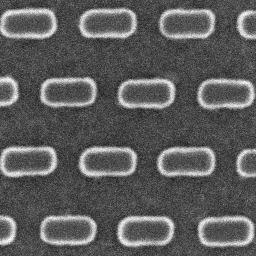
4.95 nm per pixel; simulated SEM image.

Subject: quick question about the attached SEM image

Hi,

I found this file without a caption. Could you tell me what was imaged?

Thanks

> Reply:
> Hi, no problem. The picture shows a regular array of raised bodies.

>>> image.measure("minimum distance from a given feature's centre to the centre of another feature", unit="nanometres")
386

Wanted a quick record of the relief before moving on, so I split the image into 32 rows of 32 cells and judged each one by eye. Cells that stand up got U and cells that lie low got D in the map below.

DDDDDDDDDDDDDDDDDDDDDDDDDDDDDDDD
DUUUUUDDDDDUUUUUDDDDDDUUUUDDDDDD
UUUUUUUDDDUUUUUUUDDDUUUUUUUDDDUU
UUUUUUUDDDUUUUUUUDDDUUUUUUUDDDUU
DUUUUDDDDDDUUUUDDDDDDUUUUUDDDDDU
DDDDDDDDDDDDDDDDDDDDDDDDDDDDDDDD
DDDDDDDDDDDDDDDDDDDDDDDDDDDDDDDD
DDDDDDDDDDDDDDDDDDDDDDDDDDDDDDDD
DDDDDDDDDDDDDDDDDDDDDDDDDDDDDDDD
DDDDDDDDDDDDDDDDDDDDDDDDDDDDDDDD
UUDDDDUUUUUUDDDUUUUUUDDDDUUUUUUD
UUDDDUUUUUUUDDDUUUUUUUDDDUUUUUUU
UUDDDUUUUUUUDDDUUUUUUUDDDUUUUUUD
DDDDDDDDDDDDDDDDDDDDDDDDDDDDDDDD
DDDDDDDDDDDDDDDDDDDDDDDDDDDDDDDD
DDDDDDDDDDDDDDDDDDDDDDDDDDDDDDDD
DDDDDDDDDDDDDDDDDDDDDDDDDDDDDDDD
DDDDDDDDDDDDDDDDDDDDDDDDDDDDDDDD
DDDDDDDDDDDDDDDDDDDDDDDDDDDDDDDD
UUUUUUUDDDUUUUUUUDDDUUUUUUUDDDUU
UUUUUUUDDDUUUUUUUDDDUUUUUUUDDDUU
DUUUUUDDDDDUUUUUDDDDUUUUUUDDDDUU
DDDDDDDDDDDDDDDDDDDDDDDDDDDDDDDD
DDDDDDDDDDDDDDDDDDDDDDDDDDDDDDDD
DDDDDDDDDDDDDDDDDDDDDDDDDDDDDDDD
DDDDDDDDDDDDDDDDDDDDDDDDDDDDDDDD
DDDDDDDDDDDDDDDDDDDDDDDDDDDDDDDD
UDDDDDUUUUUDDDDDUUUUUDDDDDUUUUUD
UUDDDUUUUUUUDDDUUUUUUDDDDUUUUUUD
UUDDDUUUUUUUDDDUUUUUUDDDDUUUUUUD
DDDDDDDDDDDDDDDDUUUUDDDDDDUUUUUD
DDDDDDDDDDDDDDDDDDDDDDDDDDDDDDDD